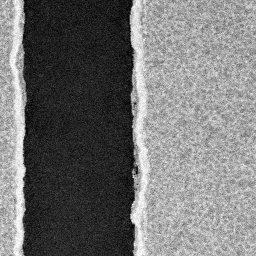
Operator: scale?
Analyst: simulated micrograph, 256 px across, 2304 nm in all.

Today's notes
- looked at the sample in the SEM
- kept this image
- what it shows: one or a few lines or trenches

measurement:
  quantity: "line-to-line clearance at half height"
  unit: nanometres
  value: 1100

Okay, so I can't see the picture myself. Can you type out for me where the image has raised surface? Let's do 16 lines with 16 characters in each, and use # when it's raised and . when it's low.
#........#######
#.......########
#........#######
#........#######
#........#######
#........#######
#........#######
#........#######
#........#######
#........#######
#........#######
#........#######
#........#######
#........#######
#........#######
#........#######